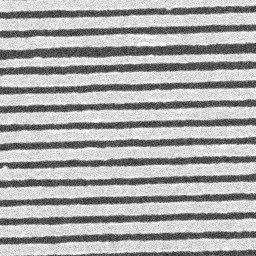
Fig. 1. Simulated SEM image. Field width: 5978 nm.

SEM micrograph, parallel lines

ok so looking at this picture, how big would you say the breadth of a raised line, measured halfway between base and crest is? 248 nm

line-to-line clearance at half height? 187 nanometres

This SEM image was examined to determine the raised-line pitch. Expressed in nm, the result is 438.